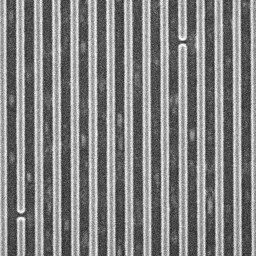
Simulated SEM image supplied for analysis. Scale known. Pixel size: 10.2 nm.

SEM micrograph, parallel lines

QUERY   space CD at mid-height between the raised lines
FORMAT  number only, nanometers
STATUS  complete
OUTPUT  110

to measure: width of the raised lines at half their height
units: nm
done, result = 79.1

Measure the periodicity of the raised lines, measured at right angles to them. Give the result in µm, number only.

0.184